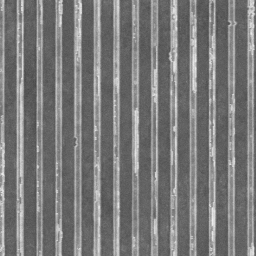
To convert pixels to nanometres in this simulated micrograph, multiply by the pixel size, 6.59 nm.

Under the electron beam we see parallel lines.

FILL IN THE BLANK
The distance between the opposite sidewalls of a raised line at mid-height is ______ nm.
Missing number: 36.2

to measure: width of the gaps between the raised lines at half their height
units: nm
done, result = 84.8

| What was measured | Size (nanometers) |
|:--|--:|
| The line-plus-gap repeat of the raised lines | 126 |